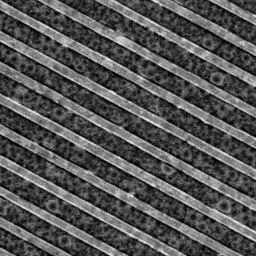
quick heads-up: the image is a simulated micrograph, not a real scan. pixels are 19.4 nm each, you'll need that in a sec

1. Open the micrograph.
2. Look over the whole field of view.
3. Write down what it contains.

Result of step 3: parallel lines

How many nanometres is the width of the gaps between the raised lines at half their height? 375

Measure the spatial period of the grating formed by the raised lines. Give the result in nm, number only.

527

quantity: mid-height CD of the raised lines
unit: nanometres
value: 160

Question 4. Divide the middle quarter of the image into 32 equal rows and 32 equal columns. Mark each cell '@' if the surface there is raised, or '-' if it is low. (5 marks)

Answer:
----------@@@@----------@@@@----
@@----------@@@@----------@@@@--
@@@@----------@@@@----------@@@@
-@@@@-----------@@@@---@------@@
---@@@@----------@@@@@----------
-----@@@@----------@@@@---------
-------@@@@----------@@@@-------
--------@@@@@----------@@@@-----
----------@@@@-----------@@@@---
@@-----------@@@-----------@@@@-
@@@@----------@@@@----------@@@@
--@@@@----------@@@@----------@@
----@@@@----------@@@@----------
-----@@@@@--@-------@@@@--------
-------@@@@-----------@@@-------
---------@@@@-----------@@@-----
@----------@@@@----------@@@@---
@@@----------@@@@----------@@@@-
-@@@@----------@@@@----------@@@
--@@@@@---------@@@@@----------@
----@@@@----------@@@@----------
------@@@@----------@@@@--------
-------@@@@@----------@@@@----@-
---------@@@@@----------@@@@----
@----------@@@@@----------@@@@--
@@@----------@@@@@-------@--@@@@
-@@@@----------@@@@------@@--@@@
---@@@@----------@@@@----------@
----@@@@@----------@@@@---------
------@@@@-----------@@@@-------
--------@@@@----------@@@@@-----
----------@@@@----------@@@@@---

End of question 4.